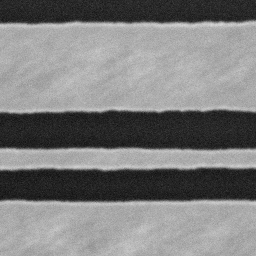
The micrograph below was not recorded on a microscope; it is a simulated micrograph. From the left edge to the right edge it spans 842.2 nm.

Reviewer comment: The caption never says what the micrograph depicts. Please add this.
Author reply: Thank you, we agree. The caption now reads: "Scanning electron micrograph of lines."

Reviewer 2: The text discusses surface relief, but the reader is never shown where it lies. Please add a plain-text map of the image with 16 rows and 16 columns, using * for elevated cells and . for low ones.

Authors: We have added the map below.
................
****************
****************
****************
****************
****************
****************
................
................
****************
*************.**
................
................
****************
****************
****************